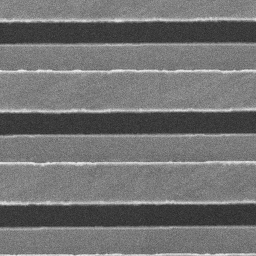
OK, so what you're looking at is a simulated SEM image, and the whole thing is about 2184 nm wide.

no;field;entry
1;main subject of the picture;lines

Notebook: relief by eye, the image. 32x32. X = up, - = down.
XXXXXXXXXXXXXXXXXXXXXXXXXXXXXXXX
XXXXXXXXXXXXXXXXXXXXXXXXXXXXXXXX
XXXXXXXXXXXXXXXXXXXXXXXXXXX----X
--------------------------------
--------------------------------
--------------------------------
XXXXXXXXXXXXXXXXXXXXXXXXXXXXXXXX
XXXXXXXXXXXXXXXXXXXXXXXXXXXXXXXX
XXXXXXXXXXXXXXXXXXXXXXXXXXXXXXXX
XXXXXXXXXXXXXXXXXXXXXXXXXXXXXXXX
XXXXXXXXXXXXXXXXXXXXXXXXXXXXXXXX
XXXXXXXXXXXXXXXXXXXXXXXXXXXXXXXX
XXXXXXXXXXXXXXXXXXXXXXXXXXXXXXXX
XXXXXXXXXXXXXXXXXXXXXXXXXXXXXXXX
--------------------------------
--------------------------------
--------------------------------
XXXXXXXXXXXXXXXXXXXXXXXXXXXXXXXX
XXXXXXXXXXXXXXXXXXXXXXXXXXXXXXXX
XXXXXXXXXXXXXXXXXXXXXXXXXXXXXXXX
XXXXXXXXXXXXXXXXXXXXXXXXXXXXXXXX
XXXXXXXXXXXXXXXXXXXXXXXXXXXXXXXX
XXXXXXXXXXXXXXXXXXXXXXXXXXXXXXXX
XXXXXXXXXXXXXXXXXXXXXXXXXXXXXXXX
XXXXXXXXXXXXXXXXXXXXXXXXXXXXXXXX
XXXXXXXXX-----------------------
--------------------------------
--------------------------------
--------------------XXXXXXXXXXXX
XXXXXXXXXXXXXXXXXXXXXXXXXXXXXXXX
XXXXXXXXXXXXXXXXXXXXXXXXXXXXXXXX
XXXXXXXXXXXXXXXXXXXXXXXXXXXXXXXX